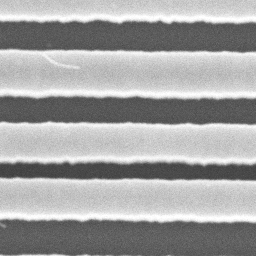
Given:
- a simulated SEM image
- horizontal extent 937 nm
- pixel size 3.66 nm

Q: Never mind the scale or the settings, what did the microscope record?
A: lines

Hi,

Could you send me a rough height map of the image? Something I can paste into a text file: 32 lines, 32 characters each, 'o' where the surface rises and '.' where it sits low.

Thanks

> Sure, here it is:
oooooooooooooooooooooooooooooooo
oooooooooooooooooooooooooooooooo
ooooooooo.o..ooo..oooooooooooooo
................................
................................
................................
oooooooooooooooooo..ooo..o.oo...
oooooooooooooooooooooooooooooooo
oooooooooooooooooooooooooooooooo
oooooooooooooooooooooooooooooooo
oooooooooooooooooooooooooooooooo
oooooooooooooooooooooooooooooooo
................................
................................
................................
oooo.ooooooo...oo...............
oooooooooooooooooooooooooooooooo
oooooooooooooooooooooooooooooooo
oooooooooooooooooooooooooooooooo
oooooooooooooooooooooooooooooooo
.........................o.oo..o
................................
ooooooooo..oo..ooo.o............
oooooooooooooooooooooooooooooooo
oooooooooooooooooooooooooooooooo
oooooooooooooooooooooooooooooooo
oooooooooooooooooooooooooooooooo
..........o.......oooo.ooooooooo
................................
................................
................................
................................